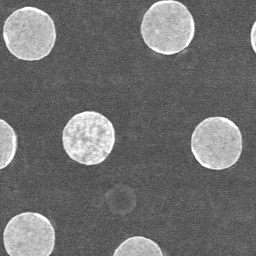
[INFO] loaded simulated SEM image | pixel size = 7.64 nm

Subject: raised bodies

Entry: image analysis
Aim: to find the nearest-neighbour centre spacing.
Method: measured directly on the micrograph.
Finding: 0.929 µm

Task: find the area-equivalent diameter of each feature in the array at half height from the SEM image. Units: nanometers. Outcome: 396